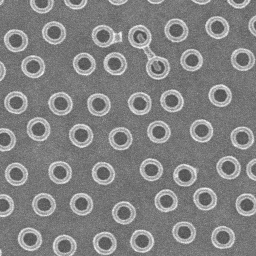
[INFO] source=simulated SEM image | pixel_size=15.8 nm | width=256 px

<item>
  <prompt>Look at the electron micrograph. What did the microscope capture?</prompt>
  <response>a regular array of ring-shaped raised bodies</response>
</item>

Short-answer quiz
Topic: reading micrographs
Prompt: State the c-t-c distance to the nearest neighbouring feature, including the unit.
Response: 539 nm